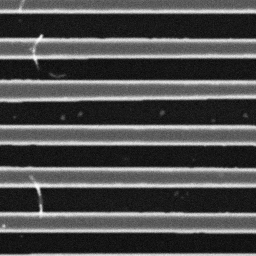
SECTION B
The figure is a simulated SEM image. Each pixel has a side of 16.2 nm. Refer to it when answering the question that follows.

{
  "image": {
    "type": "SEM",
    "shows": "lines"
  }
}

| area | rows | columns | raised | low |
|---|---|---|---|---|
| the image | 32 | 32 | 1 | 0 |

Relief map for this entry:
11111111111111111111111111111111
11111111111111111111111111111111
00000000000000000000000000000000
00000000000000000000000000000000
00000000000000000000000000000000
11111111111111111111111111111111
11111111111111111111111111111111
00000000000000000000000000000000
00000000000000000000000000000000
00000000000000000000000000000000
11111111111111111111111111111111
11111111111111111111111111111111
11111111111111110000000000000000
00000000000000000000000000000000
00000000000000000000000000000000
00000000000000000000000000000000
11111111111111111111111111111111
11111111111111111111111111111111
00000000000000000000000000000000
00000000000000000000000000000000
00000000000000000000000000000000
11111111111111111111111111111111
11111111111111111111111111111111
00001000000000000000000000000000
00000000000000000000000000000000
00000000000000000000000000000000
00000100000000000000000000000000
11111111111111111111111111111111
11111111111111111111111111111111
00000000000000000000000000000000
00000000000000000000000000000000
00000000000000000000000000000000